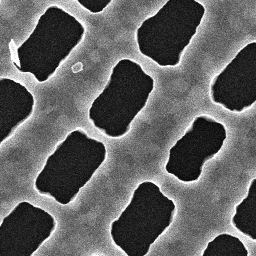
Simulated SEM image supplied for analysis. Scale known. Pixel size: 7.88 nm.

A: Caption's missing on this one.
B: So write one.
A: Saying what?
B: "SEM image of holes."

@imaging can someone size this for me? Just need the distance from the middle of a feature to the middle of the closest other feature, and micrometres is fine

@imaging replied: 0.688